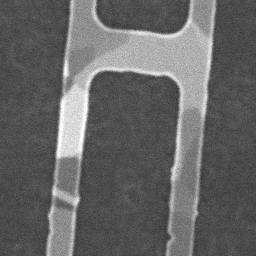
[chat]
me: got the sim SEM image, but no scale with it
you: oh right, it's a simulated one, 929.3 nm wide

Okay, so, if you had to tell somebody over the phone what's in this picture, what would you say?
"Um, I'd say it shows one or a few lines or trenches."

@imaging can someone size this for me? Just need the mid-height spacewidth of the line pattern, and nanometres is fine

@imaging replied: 342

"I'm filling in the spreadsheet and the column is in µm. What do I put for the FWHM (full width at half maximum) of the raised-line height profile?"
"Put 0.0871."